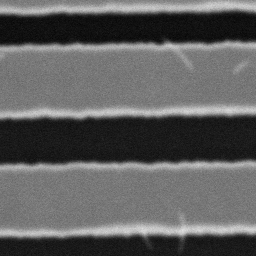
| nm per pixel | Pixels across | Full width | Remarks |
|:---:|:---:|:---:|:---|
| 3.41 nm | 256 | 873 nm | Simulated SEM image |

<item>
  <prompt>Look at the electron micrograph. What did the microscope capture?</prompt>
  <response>lines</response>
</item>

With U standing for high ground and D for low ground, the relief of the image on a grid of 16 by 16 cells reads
UUUUUUUUUUUUUUUU
DDDDDDDDDDDDDDDD
DDDDDDDDDDDDDDDD
UUUUUUUUUUUUUUUU
UUUUUUUUUUUUUUUU
UUUUUUUUUUUUUUUU
UUUUUUUUUUUUUUUU
DDDDDDDDDDDDDDDD
DDDDDDDDDDDDDDDD
DDDDDDDDDDDDDDDD
UUUUUUUUUUUUUUUU
UUUUUUUUUUUUUUUU
UUUUUUUUUUUUUUUU
UUUUUUUUUUUUUUUU
UUUUUUUUUUUUUUUU
DDDDDDDDDDDDDDDD